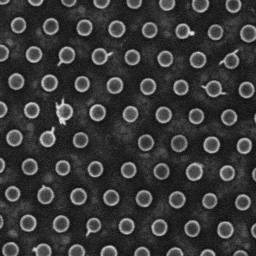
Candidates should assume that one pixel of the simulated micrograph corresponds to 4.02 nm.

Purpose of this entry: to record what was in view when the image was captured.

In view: a regular array of raised bodies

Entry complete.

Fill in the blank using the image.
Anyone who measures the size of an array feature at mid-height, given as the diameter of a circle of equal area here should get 61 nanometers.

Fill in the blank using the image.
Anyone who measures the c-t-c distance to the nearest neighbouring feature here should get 130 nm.